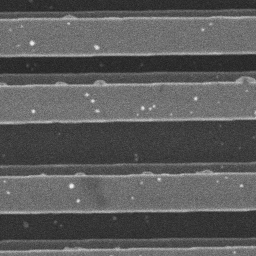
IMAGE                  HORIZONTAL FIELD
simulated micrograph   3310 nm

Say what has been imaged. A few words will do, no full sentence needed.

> lines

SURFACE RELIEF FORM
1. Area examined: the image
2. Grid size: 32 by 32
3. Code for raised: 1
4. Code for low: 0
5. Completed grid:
00000000000000000000000000000000
00000000000111111111111111111111
11111111111111111111111111111111
11111111111111111111111111111111
11111111111111111111111111111111
11111111111111111111111111111111
11111111111111111111111111111111
00000000000000000000000000000000
00000000000000000000000000000000
11111111111111111111111111111111
11111111111111111111111111111111
11111111111111111111111111111111
11111111111111111111111111111111
11111111111111111111111111111111
11111111111111111111111111111111
00000000000000000000000000000000
00000000000000000000000000000000
00000000000000000000000000000000
00000000000000000000000000000000
00000000000000000000000000000000
00000000000000000000000000111111
11111111111111111111111111111111
11111111111111111111111111111111
11111111111111111111111111111111
11111111111111111111111111111111
11111111111111111111111111111111
11111111111111100000000000000000
00000000000000000000000000000000
00000000000000000000000000000000
00000000000000000000000000000000
11111111111111111111111111111111
11111111111111111111111111111111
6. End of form